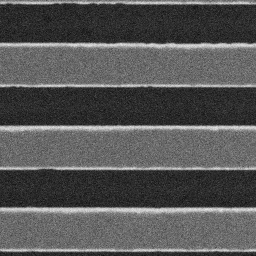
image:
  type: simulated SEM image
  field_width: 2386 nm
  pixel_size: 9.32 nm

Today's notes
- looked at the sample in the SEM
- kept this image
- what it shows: lines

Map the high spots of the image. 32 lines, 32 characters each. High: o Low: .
................................
................................
................................
................................
................................
ooooooooooooo.ooooo..o...o.o.oo.
oooooooooooooooooooooooooooooooo
oooooooooooooooooooooooooooooooo
oooooooooooooooooooooooooooooooo
oooooooooooooooooooooooooooooooo
oooooooooooooooooooooooooooooooo
................................
................................
................................
................................
................................
oooooooooooooooooooooooooooooooo
oooooooooooooooooooooooooooooooo
oooooooooooooooooooooooooooooooo
oooooooooooooooooooooooooooooooo
oooooooooooooooooooooooooooooooo
................................
................................
................................
................................
................................
oooooooooooooooooooooooooooooooo
oooooooooooooooooooooooooooooooo
oooooooooooooooooooooooooooooooo
oooooooooooooooooooooooooooooooo
oooooooooooooooooooooooooooooooo
................................